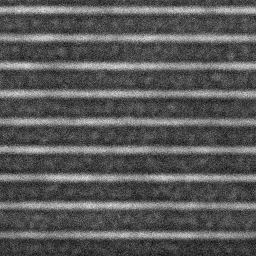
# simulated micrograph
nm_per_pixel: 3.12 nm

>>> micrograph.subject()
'parallel lines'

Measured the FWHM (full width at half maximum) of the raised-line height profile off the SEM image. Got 20.3 nm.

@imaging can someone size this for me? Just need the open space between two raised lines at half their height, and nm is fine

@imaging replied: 67.2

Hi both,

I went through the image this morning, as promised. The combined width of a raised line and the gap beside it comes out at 87.9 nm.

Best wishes